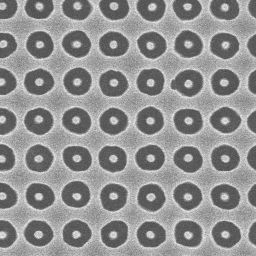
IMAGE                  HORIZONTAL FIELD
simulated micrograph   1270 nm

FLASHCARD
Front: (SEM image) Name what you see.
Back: a regular array of ring-shaped grooves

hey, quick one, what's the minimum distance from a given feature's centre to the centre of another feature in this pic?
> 0.181 µm